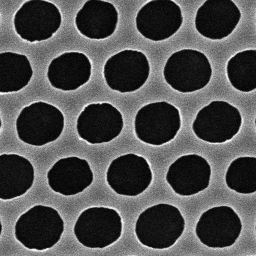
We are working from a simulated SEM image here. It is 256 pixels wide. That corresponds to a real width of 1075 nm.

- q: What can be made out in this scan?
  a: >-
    a regular array of holes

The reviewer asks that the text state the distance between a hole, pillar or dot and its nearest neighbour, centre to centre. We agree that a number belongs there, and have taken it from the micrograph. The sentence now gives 0.247 um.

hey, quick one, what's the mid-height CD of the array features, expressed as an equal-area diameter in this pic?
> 187 nm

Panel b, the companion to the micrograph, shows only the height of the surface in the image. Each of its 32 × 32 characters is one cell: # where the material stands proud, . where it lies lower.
###....####...####....###....###
##.....###.....##......##.....##
##......#......##......#......##
##.....###....###.....##.....###
###...#####...####...####...####
################################
###############...####...#####..
....###....###....###.....###...
....##.....##......##.....##....
....##.....##......##.....###...
...###....###.....###.....###...
..#############.#######.########
################################
###....####...####....###....###
##......##.....##.....###.....##
##......##.....##......#......##
##......##.....##.....##......##
###....####...####...####...####
################################
...############..######..#######
....###....###....###.....###...
....##.....##......##.....##....
....##......#......##.....##....
....##.....###....####....###...
..##############.###############
####################.###########
###....###....####.....###...###
##......##.....##......##.....##
##......#......##......#......##
##......#......##......##.....##
###....###....####....####...###
################################